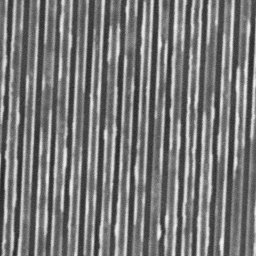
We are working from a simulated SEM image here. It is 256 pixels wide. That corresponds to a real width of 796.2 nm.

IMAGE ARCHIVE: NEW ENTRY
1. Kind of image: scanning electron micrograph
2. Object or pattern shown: parallel lines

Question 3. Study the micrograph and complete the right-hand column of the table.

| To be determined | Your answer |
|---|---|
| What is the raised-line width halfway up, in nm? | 30.7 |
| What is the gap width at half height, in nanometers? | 19.4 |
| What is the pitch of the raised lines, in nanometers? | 50.4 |